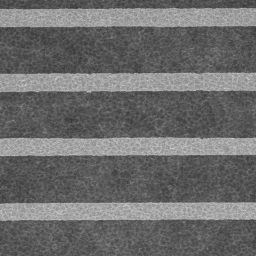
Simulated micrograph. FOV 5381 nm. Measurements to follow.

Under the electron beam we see one or a few lines or trenches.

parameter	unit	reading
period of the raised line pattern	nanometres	1360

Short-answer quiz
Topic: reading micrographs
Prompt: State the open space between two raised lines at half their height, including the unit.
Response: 0.999 micrometres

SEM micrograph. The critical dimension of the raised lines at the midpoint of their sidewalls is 0.349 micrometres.